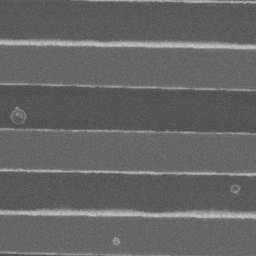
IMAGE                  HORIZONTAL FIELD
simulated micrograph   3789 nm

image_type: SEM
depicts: lines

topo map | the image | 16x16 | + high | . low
................
................
................
++++++++++++++++
++++++++++++++++
...........+++++
................
................
++++++++++++++++
++++++++++++++++
++++++++++++++++
................
................
+++++++++++++++.
++++++++++++++++
++++++++++++++++